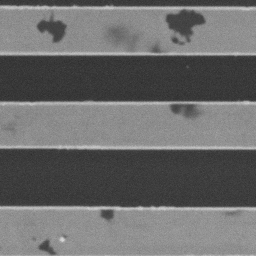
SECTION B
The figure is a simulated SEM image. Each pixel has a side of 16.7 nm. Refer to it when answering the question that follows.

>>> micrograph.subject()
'lines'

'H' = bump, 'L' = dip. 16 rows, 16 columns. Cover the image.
HHHHHHHHHHHHHHHH
HHHHHHHHHHHHHHHH
HHHHHHHHHHHHHHHH
LLLLLLLLLLLLLLLL
LLLLLLLLLLLLLLLL
LLLLLLLLLLLLLLLL
HHHHHHHHHHHHHHHH
HHHHHHHHHHHHHHHH
HHHHHHHHHHHHHHHH
LLLLLLLLLLLLLLLL
LLLLLLLLLLLLLLLL
LLLLLLLLLLLLLLLL
LLLLLLLLLLLLLLLL
HHHHHHHHHHHHHHHH
HHHHHHHHHHHHHHHH
HHHHHHHHHHHHHHHH